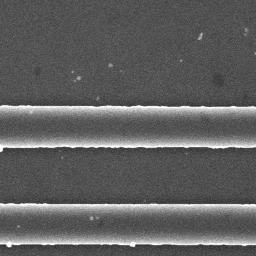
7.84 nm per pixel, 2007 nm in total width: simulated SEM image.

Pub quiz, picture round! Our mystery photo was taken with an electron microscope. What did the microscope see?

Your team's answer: lines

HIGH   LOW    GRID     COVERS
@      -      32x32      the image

--------------------------------
--------------------------------
--------------------------------
--------------------------------
--------------------------------
--------------------------------
--------------------------------
--------------------------------
--------------------------------
--------------------------------
--------------------------------
--------------------------------
--------------------------------
@@@@@@@@@@@@@@@@@@@@@@@@@@@@@@@@
@@@@@@@@@@@@@@@@@@@@@@@@@@@@@@@@
@@@@@@@@@@@@@@@@@@@@@@@@@@@@@@@@
@@@@@@@@@@@@@@@@@@@@@@@@@@@@@@@@
@@@@@@@@@@@@@@@@@@@@@@@@@@@@@@@@
@-------------------------------
--------------------------------
--------------------------------
--------------------------------
--------------------------------
--------------------------------
--------------------------------
--------------------------------
@@@@@@@@@@@@@@@@@@@@@@@@@@@@@@@@
@@@@@@@@@@@@@@@@@@@@@@@@@@@@@@@@
@@@@@@@@@@@@@@@@@@@@@@@@@@@@@@@@
@@@@@@@@@@@@@@@@@@@@@@@@@@@@@@@@
@@@--@@--@--@@@@@--@@@@@@@@@@@@@
--------------------------------